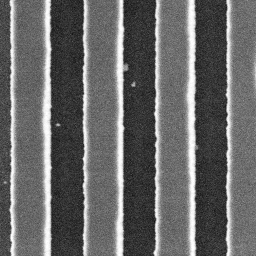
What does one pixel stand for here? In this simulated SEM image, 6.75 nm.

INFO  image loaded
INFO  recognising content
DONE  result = lines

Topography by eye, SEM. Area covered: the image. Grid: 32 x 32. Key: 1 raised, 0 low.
01111100000111100000111100001111
01111100000111100001111100001111
01111100000111100001111100001111
01111100000111100001111100001111
01111100001111100001111100001111
01111100001111100001111100001111
01111100000111100001111100001111
01111100000111100001111100001111
01111100001111100001111100001111
01111100001111100001111100001111
01111100001111100001111100001111
01111100000111100001111100001111
01111100001111100001111100001111
01111100001111100001111100001111
01111100000111100001111100001111
00111100001111100001111100001111
01111100001111100001111100001111
01111100000111100000111100001111
01111100000111100001111100000111
01111100000111100001111100001111
01111100000111100001111100001111
01111100001111100001111100001111
01111100000111100001111100001111
01111100001111100001111100001111
01111100000111100001111100001111
01111100000111100001111100001111
01111100000111100001111100001111
01111100000111100001111100000111
00111100000111100001111100001111
01111100001111100001111100001111
00111100001111100001111100001111
01111100001111100001111100001111